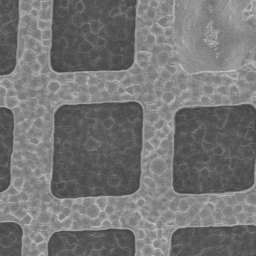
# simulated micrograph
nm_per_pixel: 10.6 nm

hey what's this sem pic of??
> holes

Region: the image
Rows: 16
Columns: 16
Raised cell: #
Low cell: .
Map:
.##......#######
.##.....########
.##.....########
.##.....########
.###############
################
######...#######
.##......##.....
.##......##.....
.##......##.....
.##......##.....
.##......##.....
################
################
.###....###.....
.##.....###.....